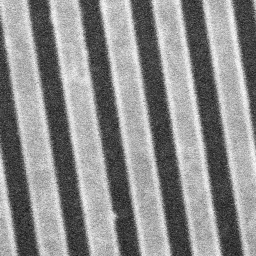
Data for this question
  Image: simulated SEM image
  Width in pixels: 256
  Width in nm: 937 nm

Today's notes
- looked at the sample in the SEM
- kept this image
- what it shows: parallel lines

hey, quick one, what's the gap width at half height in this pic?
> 96.5 nm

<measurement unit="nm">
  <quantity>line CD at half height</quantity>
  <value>90.2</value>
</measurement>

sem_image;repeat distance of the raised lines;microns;0.184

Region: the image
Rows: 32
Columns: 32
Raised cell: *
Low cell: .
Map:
***...****...***...***....***...
***....***...***...***....***...
****...***...***....***...***...
.***...***...***....***...***...
.***...***...****...***...***...
.***...***....***...***...***...
.***...****...***...***....***..
.***....***...***...***....***..
.***....***...***....***...***..
..***...***...***....***...***..
..***...***...****...***...***..
..***...***....***...***...***..
..***...****...***...***....***.
..***....***...***...***....***.
..***....***...***....***...***.
...***...***...***....***...***.
...***...***...****...***...***.
...***...***....***...***...***.
...***...***....***...***....***
...***....***...***...***....***
...***....***...***....***...***
...****...***...***....***...***
....***...***...****...***...***
....***...***....***...***...***
*...***...***....***...***....**
*...***....***...***...***....**
*...***....***...***....***...**
*...****...***...***....***...**
*....***...***...***....***...**
*....***...***....***...***...**
**...***...***....***...***....*
**...***...****...***...***....*